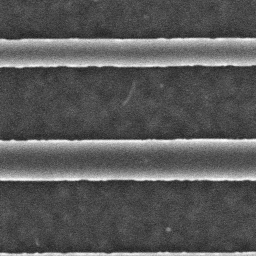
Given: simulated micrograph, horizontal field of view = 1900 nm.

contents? lines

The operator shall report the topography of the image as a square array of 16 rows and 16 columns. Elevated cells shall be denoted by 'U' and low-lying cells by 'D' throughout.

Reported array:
DDDDDDDDDDDDDDDD
DDDDDDDDDDDDDDDD
UUUUUUUUUUUUUUUU
UUUUUUUUUUUUUUUU
DDDDDDDDDDDDDDDD
DDDDDDDDDDDDDDDD
DDDDDDDDDDDDDDDD
DDDDDDDDDDDDDDDD
DDDDDDDDDDDDDDDD
UUUUUUUUUUUUUUUU
UUUUUUUUUUUUUUUU
DDDDDDDDDDDDDDDD
DDDDDDDDDDDDDDDD
DDDDDDDDDDDDDDDD
DDDDDDDDDDDDDDDD
DDDDDDDDDDDDDDDD